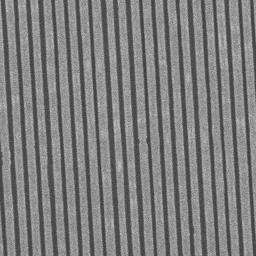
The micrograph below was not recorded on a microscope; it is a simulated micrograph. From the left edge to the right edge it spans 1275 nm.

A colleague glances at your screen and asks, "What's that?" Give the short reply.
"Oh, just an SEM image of parallel lines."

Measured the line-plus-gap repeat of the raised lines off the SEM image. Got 61.9 nm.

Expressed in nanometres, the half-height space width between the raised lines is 22.4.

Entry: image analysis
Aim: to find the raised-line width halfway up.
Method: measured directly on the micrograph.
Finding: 0.0404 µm